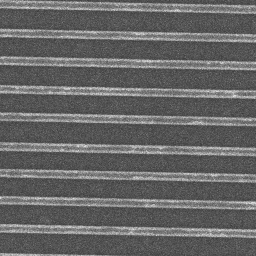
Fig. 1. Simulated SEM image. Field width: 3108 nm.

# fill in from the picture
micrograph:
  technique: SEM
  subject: parallel lines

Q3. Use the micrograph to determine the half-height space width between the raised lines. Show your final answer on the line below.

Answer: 0.264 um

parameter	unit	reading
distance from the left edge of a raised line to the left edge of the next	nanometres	340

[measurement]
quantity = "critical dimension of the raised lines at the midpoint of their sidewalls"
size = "77.4 nanometres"